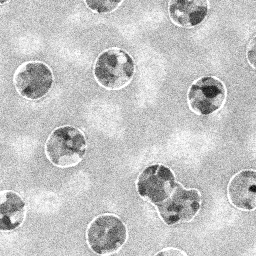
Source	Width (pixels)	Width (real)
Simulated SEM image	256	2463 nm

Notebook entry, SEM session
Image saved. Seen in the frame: raised bodies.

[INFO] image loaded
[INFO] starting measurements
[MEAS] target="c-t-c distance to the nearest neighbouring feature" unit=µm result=0.745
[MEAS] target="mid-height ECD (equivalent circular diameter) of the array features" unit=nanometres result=385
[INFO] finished